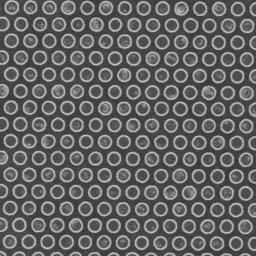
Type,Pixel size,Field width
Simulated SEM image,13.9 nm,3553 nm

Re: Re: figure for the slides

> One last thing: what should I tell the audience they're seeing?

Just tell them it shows a regular array of raised bodies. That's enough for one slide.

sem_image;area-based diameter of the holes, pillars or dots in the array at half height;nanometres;176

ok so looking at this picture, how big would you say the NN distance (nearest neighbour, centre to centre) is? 260 nm